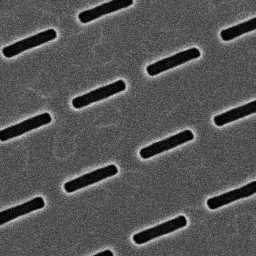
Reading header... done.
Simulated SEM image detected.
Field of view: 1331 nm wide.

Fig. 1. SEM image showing holes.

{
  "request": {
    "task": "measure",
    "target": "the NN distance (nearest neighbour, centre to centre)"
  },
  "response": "432 nanometers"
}